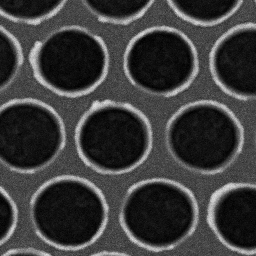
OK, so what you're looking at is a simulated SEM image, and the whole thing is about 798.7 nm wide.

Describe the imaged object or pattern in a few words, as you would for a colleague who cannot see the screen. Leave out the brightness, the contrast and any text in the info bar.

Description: holes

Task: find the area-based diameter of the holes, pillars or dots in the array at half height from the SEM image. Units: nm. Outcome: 202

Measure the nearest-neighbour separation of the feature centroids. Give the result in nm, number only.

274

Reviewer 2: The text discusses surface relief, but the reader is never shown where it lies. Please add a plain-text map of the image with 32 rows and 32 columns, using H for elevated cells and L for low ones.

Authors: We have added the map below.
LLLLLLLHHHHLLLLLLLHHHHLLLLLLLHHH
HLLLLLHHHHHHLLLLLHHHHHHLLLLLHHHH
HHHHHHHHHHHHHHHHHHHHHHHHHHHHHHHH
HHHHHHHHHHHHHHHHHHHHHHHHHHHHHHHH
LHHHHHHLLLLHHHHHHHLLLLLHHHHHHLLL
LLHHHHLLLLLLHHHHHLLLLLLHHHHHLLLL
LLHHHLLLLLLLLHHHLLLLLLLLHHHLLLLL
LLHHHLLLLLLLLHHHLLLLLLLLHHHLLLLL
LLHHHLLLLLLLLHHHLLLLLLLLHHHLLLLL
LLHHHLLLLLLLLHHHLLLLLLLLHHHLLLLL
LHHHHHLLLLLLHHHHHLLLLLLHHHHHLLLL
HHHHHHHHHHHHHHHHHHHHHHHHHHHHHLLL
HHHHHHHHHHHHHHHHHHHHHHHHHHHHHHHH
HLLLLHHHHHHHHHLHHHHHHHHHLLLHHHHH
LLLLLLLHHHHLLLLLLHHHHHLLLLLLHHHH
LLLLLLLHHHHLLLLLLLHHHHLLLLLLLHHH
LLLLLLLLHHLLLLLLLLHHHLLLLLLLLLHH
LLLLLLLLHHLLLLLLLLHHHLLLLLLLLLHH
LLLLLLLHHHLLLLLLLLHHHLLLLLLLLLHH
LLLLLLLHHHHLLLLLLLHHHHLLLLLLLHHH
HLLLLHHHHHHHLLLLLHHHHHHLLLLLHHHH
HHHHHHHHHHHHHHHHHHHHHHHHHHHHHHHH
HHHHHHHHHHHHHHHHHHHHHHHHHHHHHHHH
HHHHHHLLLLLHHHHHHLLLLLHHHHHHHHHH
HHHHHLLLLLLLHHHHLLLLLLLHHHHHLLLL
LHHHLLLLLLLLLHHHLLLLLLLLHHHLLLLL
LLHHLLLLLLLLLHHLLLLLLLLLHHHLLLLL
LHHHLLLLLLLLLHHHLLLLLLLLHHHLLLLL
LHHHHLLLLLLLHHHHLLLLLLLLHHHLLLLL
LHHHHHLLLLLLHHHHHLLLLLLHHHHHLLLL
HHHHHHHLLLHHHHHHHHHLLHHHHHHHHLLL
HHHHHHHHHHHHHHHHHHHHHHHHHHHHHHHH